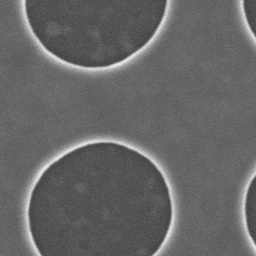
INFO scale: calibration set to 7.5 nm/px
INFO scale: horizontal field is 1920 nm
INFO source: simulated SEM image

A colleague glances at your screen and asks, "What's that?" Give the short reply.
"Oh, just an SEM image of holes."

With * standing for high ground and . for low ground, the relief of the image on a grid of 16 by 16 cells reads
**........*****.
**........******
**.......*******
***.....********
****************
****************
****************
****************
****************
****.....*******
***.......******
**........******
**.........****.
**.........****.
**.........*****
**........******